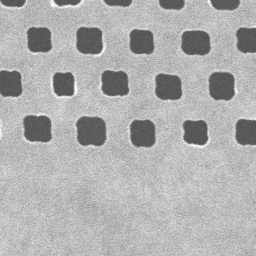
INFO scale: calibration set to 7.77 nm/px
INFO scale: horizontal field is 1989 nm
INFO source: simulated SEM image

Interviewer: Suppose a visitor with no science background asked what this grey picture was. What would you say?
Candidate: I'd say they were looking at a regular array of holes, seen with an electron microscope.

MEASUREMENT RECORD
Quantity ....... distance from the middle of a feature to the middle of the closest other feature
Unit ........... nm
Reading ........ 395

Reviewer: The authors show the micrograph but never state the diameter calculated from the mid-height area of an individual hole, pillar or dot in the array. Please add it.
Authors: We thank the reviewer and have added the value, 220 nm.